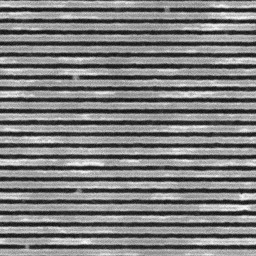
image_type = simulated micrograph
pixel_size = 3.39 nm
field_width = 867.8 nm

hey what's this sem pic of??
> parallel lines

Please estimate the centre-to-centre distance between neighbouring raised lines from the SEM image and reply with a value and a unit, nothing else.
38.3 nanometres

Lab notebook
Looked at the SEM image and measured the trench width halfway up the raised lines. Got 18.7 nanometres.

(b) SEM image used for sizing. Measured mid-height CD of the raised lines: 18.7 nanometers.